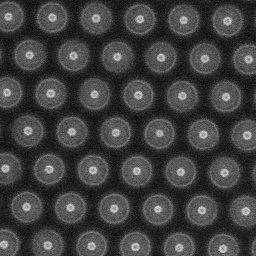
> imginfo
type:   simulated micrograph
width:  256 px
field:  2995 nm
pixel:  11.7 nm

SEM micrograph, an array of small figures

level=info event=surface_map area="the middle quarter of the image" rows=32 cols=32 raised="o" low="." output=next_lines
.....oooooo.....ooooo......ooooo
oo.ooooooooo...oooooooo...oooooo
oooooooooooooooooooooooooooooooo
oooooooooooooooooooooooooooooooo
oooooo...oooooooo...ooooooooo.oo
ooooo.....oooooo.....oooooo.....
oooo.......oooo.......oooo......
oooo...o...oooo...o...oooo...o..
oooo.......oooo...o...oooo...o..
ooooo......ooooo......oooo......
oooooo....ooooooo....oooooo.....
ooooooooooooooooooooooooooooo.oo
oooooooooooooooooooooooooooooooo
oooooooooooooooooooooooooooooooo
....ooooooo....ooooooo....oooooo
.....ooooo......ooooo......ooooo
.o...ooooo..o...ooooo......ooooo
.....oooo...oo..oooo...oo..oooo.
.....ooooo......ooooo......ooooo
....oooooo.....oooooo......ooooo
o.oooooooooo..oooooooo...ooooooo
oooooooooooooooooooooooooooooooo
oooooooooooooooooooooooooooooooo
oooooo...oooooooo..oooooooooo.oo
oooo......oooooo.....oooooo.....
oooo......ooooo......ooooo......
oooo...o...oooo...o...oooo...o..
oooo.......oooo.......oooo...o..
oooo......ooooo......ooooo......
ooooo....ooooooo....ooooooo.....
ooooooooooooooooooooooooooooo.oo
oooooooooooooooooooooooooooooooo